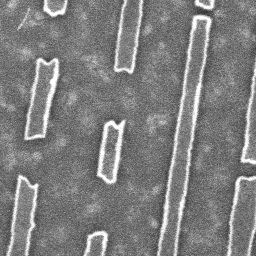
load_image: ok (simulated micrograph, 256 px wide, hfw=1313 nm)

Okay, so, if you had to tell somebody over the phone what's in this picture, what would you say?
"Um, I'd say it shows one or a few lines or trenches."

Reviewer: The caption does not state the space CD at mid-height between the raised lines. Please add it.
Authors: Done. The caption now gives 273 nm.